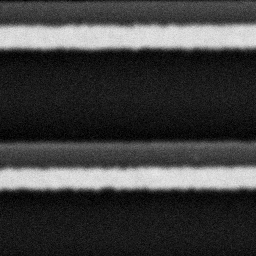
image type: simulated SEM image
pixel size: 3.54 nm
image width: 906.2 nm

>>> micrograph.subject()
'lines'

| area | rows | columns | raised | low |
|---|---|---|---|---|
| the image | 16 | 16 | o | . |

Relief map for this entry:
oooooooooooooooo
oooooooooooooooo
oooooooooooooooo
................
................
................
................
................
................
oooooooooooooooo
oooooooooooooooo
oooooooooooooooo
................
................
................
................